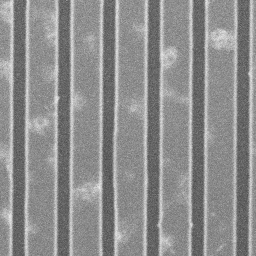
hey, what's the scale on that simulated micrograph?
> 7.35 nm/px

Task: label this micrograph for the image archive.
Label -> parallel lines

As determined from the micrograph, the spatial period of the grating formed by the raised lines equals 329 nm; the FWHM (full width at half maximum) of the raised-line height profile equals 228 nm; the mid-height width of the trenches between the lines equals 0.105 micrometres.